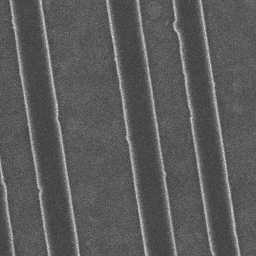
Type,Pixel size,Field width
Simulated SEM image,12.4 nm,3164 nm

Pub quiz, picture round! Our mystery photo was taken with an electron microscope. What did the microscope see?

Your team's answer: one or a few lines or trenches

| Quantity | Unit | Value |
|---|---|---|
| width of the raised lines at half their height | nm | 371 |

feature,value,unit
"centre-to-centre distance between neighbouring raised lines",0.987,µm